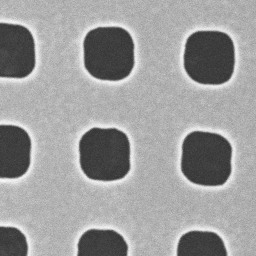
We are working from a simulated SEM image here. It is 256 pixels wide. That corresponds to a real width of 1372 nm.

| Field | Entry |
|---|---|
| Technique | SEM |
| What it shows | holes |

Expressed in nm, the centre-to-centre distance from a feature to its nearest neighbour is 541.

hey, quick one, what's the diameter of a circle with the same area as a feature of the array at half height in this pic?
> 55.5 pixels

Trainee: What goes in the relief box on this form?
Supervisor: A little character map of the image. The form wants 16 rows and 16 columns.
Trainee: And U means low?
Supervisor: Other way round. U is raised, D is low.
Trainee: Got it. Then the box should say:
UUUUUUUUUUUUUUUU
DUUUUUUUUUUUUUUU
DDUUUDDDUUUUDDUU
DDUUUDDDUUUDDDDU
DDUUUUDDUUUUDDDU
UUUUUUUUUUUUUUUU
UUUUUUUUUUUUUUUU
UUUUUUUUUUUUUUUU
DDUUUDDDUUUUDDUU
DDUUUDDDUUUDDDUU
DDUUUDDDUUUDDDUU
UUUUUUUUUUUUDDUU
UUUUUUUUUUUUUUUU
UUUUUUUUUUUUUUUU
DUUUUDDUUUUUDUUU
DDUUUDDDUUUDDDUU